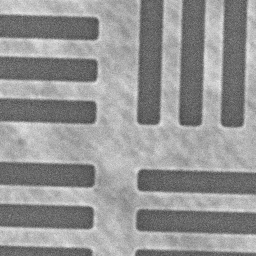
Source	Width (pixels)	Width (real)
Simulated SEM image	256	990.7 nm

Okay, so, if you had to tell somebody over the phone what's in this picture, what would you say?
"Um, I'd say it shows groups of lines, slits or small figures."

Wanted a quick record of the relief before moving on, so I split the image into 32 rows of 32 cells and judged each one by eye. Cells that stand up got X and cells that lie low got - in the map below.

XXXXXXXXXXXXXXXXX----XX---XX---X
XXXXXXXXXXXXXXXXX----XX---XX---X
------------XXXXX----XX---XX---X
-------------XXXX----XX---XX---X
------------XXXXX---XXX---XX---X
XXXXXXXXXXXXXXXXX---XXX---XX---X
XXXXXXXXXXXXXXXXX---XX----XX---X
------------XXXXX---XX----XX---X
------------XXXXX---XX----XX---X
------------XXXXX---XX----XX---X
XXXXXXXXXXXXXXXXX---XX----XX---X
XXXXXXXXXXXXXXXXX---XX---XXX---X
-----------XXXXXX---XX---XXX---X
------------XXXXX---XX---XX----X
------------XXXXX---XX---XX----X
XXXXX-------XXXXX---XX---XXX---X
XXXXXXXXXXXXXXXXXXXXXXXXXXXXXXXX
XXXXXXXXXXXXXXXXXXXXXXXXXXXXXXXX
XXXXXXXXXXXXXXXXXXXXXXXXXXXXXXXX
XXXXXXXXXXXXXXXXXXXXXXXXXXXXXXXX
-----------XXXXXXXXXXXXXXXXXXXXX
------------XXXXX---------------
------------XXXXX---------------
XXXXXXX----XXXXXX---------------
XXXXXXXXXXXXXXXXXXXXXXXXXXXXXXXX
--------XXXXXXXXXXXXXXXXXXXXXXXX
------------XXXXX---------------
------------XXXXX---------------
------------XXXXX---------------
XXXXXXXXXXXXXXXXXXXXXXXXXXXXXXX-
XXXXXXXXXXXXXXXXXXXXXXXXXXXXXXXX
------------XXXXX---------------